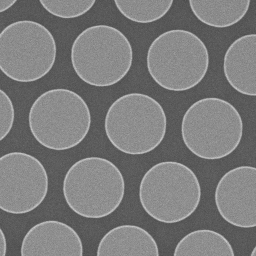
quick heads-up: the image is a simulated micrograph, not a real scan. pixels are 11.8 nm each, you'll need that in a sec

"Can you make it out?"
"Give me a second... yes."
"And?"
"an array of small figures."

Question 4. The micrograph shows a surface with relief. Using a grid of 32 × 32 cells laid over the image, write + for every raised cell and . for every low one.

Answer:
++...+++++++..+++++++...+++++++.
......+++++....++++++...+++++++.
.................+++.....+++++..
.+++++.....+++..................
+++++++...++++++....+++++......+
+++++++..+++++++...++++++....+++
+++++++..+++++++...+++++++..++++
+++++++..+++++++..++++++++..++++
++++++...+++++++..++++++++..++++
.++++.....+++++....++++++...++++
...........+++......+++++....+++
......+++.....................++
+....+++++.....++++......+++....
++..+++++++...++++++....+++++...
++..+++++++..++++++++..+++++++..
++..+++++++..++++++++..+++++++..
+...+++++++..++++++++..+++++++..
.....+++++....++++++...+++++++..
......+++......++++.....+++++...
++++.....................+++....
+++++....+++++......+++.........
++++++..+++++++...++++++.....+++
++++++..+++++++...+++++++...++++
++++++..+++++++...+++++++..+++++
++++++..+++++++..++++++++..+++++
+++++....++++++...+++++++..+++++
.++......+++++....++++++...+++++
....................+++.....++++
....+++++.....+++...............
+..+++++++...++++++....+++++....
+..+++++++..++++++++..+++++++...
+..+++++++..++++++++..+++++++...